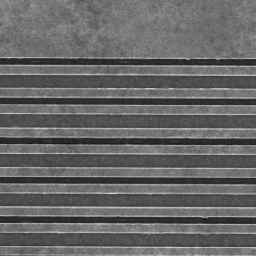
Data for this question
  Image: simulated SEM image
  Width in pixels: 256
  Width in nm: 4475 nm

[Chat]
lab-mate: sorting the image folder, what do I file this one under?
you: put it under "parallel lines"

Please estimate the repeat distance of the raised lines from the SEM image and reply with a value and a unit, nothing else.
19.9 pixels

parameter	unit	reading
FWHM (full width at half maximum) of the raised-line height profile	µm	0.157